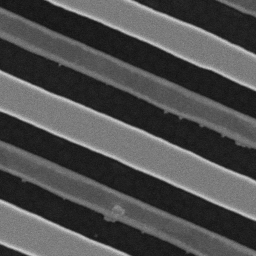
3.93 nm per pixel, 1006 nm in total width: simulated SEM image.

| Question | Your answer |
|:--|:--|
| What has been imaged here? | lines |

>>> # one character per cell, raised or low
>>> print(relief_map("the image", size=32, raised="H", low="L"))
LLLLLLLHHHHHHHHHHHLLLLLLLLLLHHHH
HLLLLLLLLHHHHHHHHHHHLLLLLLLLLLHH
HHHLLLLLLLLLHHHHHHHHHHLLLLLLLLLL
HHHHHHLLLLLLLLHHHHHHHHHHHLLLLLLL
HHHHHHHHLLLLLLLLHHHHHHHHHHHLLLLL
LLHHHHHHHHLLLLLLLLLHHHHHHHHHHLLL
LLLLHHHHHHHHHLLLLLLLLHHHHHHHHHHL
LLLLLLLHHHHHHHHLLLLLLLLHHHHHHHHH
LLLLLLLLLHHHHHHHHLLLLLLLLHHHHHHH
HHLLLLLLLLLHHHHHHHHHLLLLLLLLHHHH
HHHHLLLLLLLLLLHHHHHHHHLLLLLLLLHH
HHHHHHLLLLLLLLLLHHHHHHHHLLLLLLLL
HHHHHHHHHLLLLLLLLLHHHHHHHHLLLLLL
HHHHHHHHHHHLLLLLLLLLHHHHHHHHLLLL
LHHHHHHHHHHHHHLLLLLLLLLHHHHHHHHL
LLLLHHHHHHHHHHHHLLLLLLLLLHHHHHHH
LLLLLLHHHHHHHHHHHHLLLLLLLLLHHHHH
LLLLLLLLHHHHHHHHHHHHHLLLLLLLLLHH
HHLLLLLLLLLHHHHHHHHHHHHLLLLLLLLL
HHHHLLLLLLLLLHHHHHHHHHHHHLLLLLLL
HHHHHHHLLLLLLLLLHHHHHHHHHHHLLLLL
LHHHHHHHHLLLLLLLLLHHHHHHHHHHHHLL
LLLHHHHHHHHLLLLLLLLLHHHHHHHHHHHH
LLLLLLHHHHHHHHLLLLLLLLHHHHHHHHHH
LLLLLLLLHHHHHHHHLLLLLLLLLHHHHHHH
HLLLLLLLLLHHHHHHHHLLLLLLLLLHHHHH
HHHHLLLLLLLLHHHHHHHHHLLLLLLLLHHH
HHHHHHLLLLLLLLLHHHHHHHHLLLLLLLLL
HHHHHHHHLLLLLLLLLHHHHHHHHLLLLLLL
HHHHHHHHHHHLLLLLLLLLHHHHHHHHLLLL
HHHHHHHHHHHHHLLLLLLLLLHHHHHHHHLL
LLHHHHHHHHHHHHHLLLLLLLLLHHHHHHHH